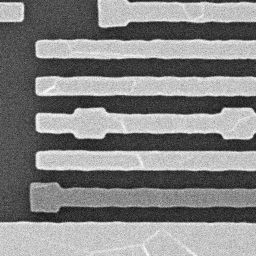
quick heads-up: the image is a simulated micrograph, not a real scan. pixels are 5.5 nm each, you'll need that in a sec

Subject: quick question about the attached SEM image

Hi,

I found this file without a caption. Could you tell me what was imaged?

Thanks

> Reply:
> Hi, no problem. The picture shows wiring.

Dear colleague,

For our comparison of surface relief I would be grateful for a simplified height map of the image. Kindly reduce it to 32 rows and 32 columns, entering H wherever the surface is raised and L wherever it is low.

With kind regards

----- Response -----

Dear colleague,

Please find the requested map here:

HHHLLLLLLLLLHHHHHHHHHHHHHHHHHHHH
HHHLLLLLLLLLHHHHHHHHHHHHHHHHHHHH
HHHLLLLLLLLLHHHHHHHHHHHHHHHHHHHH
LLLLLLLLLLLLLLLLLLLLLLLLLLLLLLLL
LLLLLLLLLLLLLLLLLLLLLLLLLLLLLLLL
LLLLLHHHHHHHHHHHHHHHHHHHHHHHHHHH
LLLLLHHHHHHHHHHHHHHHHHHHHHHHHHHH
LLLLLLLLLLLLLLLLLLLLLLLLLLLLLLLL
LLLLLLLLLLLLLLLLLLLLLLLLLLLLLLLL
LLLLLLLLLLLLLLLLLLLLLLLLLLLLLLLL
LLLLLHHHHHHHHHHHHHHHHHHHHHHHHHHH
LLLLLHHHHHHHHHHHHHHHHHHHHHHHHHHH
LLLLLLLLLLLLLLLLLLLLLLLLLLLLLLLL
LLLLLLLLLLLLLLLLLLLLLLLLLLLLLLLL
LLLLLHHHHHHHHHHHHHHHHHHHHHHHHHHH
LLLLLHHHHHHHHHHHHHHHHHHHHHHHHHHH
LLLLLHHHHHHHHHHHHHHHHHHHHHHHHHHH
LLLLLLLLLLLLLLLLLLLLLLLLLLLLLLLL
LLLLLLLLLLLLLLLLLLLLLLLLLLLLLLLL
LLLLLHHHHHHHHHHHHHHHHHHHHHHHHHHH
LLLLLHHHHHHHHHHHHHHHHHHHHHHHHHHH
LLLLLLLLLLLLLLLLLLLLLLLLLLLLLLLL
LLLLLLLLLLLLLLLLLLLLLLLLLLLLLLLL
LLLLHHHHLLLLLLLLLLLLLLLLLLLLLLLL
LLLLHHHHHHHHHHHHHHHHHHHHHHHHHHHH
LLLLHHHHHHHHHHHHHHHHHHHHHHHHHHHH
LLLLLLLLLLLLLLLLLLLLLLLLLLLLLLLL
LLLLLLLLLLLLLLLLLLLLLLLLLLLLLLLL
HHHHHHHHHHHHHHHHHHHHHHHHHHHHHHHH
HHHHHHHHHHHHHHHHHHHHHHHHHHHHHHHH
HHHHHHHHHHHHHHHHHHHHHHHHHHHHHHHH
HHHHHHHHHHHHHHHHHHHHHHHHHHHHHHHH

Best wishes